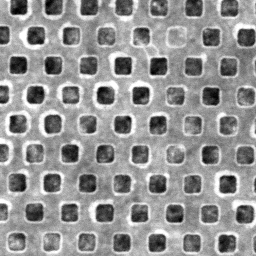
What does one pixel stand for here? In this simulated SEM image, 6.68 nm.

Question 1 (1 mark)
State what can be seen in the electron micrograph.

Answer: a regular array of holes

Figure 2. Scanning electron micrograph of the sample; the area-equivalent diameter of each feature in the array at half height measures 0.138 um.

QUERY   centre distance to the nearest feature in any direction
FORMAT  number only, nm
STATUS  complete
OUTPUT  228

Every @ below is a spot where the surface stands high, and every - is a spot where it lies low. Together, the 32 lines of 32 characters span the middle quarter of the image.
@@@@-----@@@-----@@@@-----@@@@--
@@@@----@@@@-----@@@@-----@@@@--
@@@@----@@@@@----@@@@-----@@@@--
@@@@@@@@@@@@@@@@@@@@@@@@@@@@@@@@
@@@@@@@@@@@@@@@@@@@@@@@@@@@@@@@@
----@@@@@---@@@@@@--@@@@@@@--@@@
----@@@@-----@@@@-----@@@@----@@
----@@@@-----@@@@-----@@@@----@@
----@@@@-----@@@@-----@@@@----@@
----@@@@-----@@@@----@@@@-----@@
@@@@@@@@@--@@@@@@@@@@@@@@@@@@@@@
@@@@@@@@@@@@@@@@@@@@@@@@@@@@@@@@
@@@@@@@@@@@@@@@@@@@@@@@@@@@@@@@@
@@@@----@@@@@----@@@@-----@@@@--
@@@-----@@@@-----@@@@-----@@@@--
@@@-----@@@@-----@@@@-----@@@@--
@@@@----@@@@-----@@@@-----@@@@--
@@@@@--@@@@@@----@@@@@---@@@@@--
@@@@@@@@@@@@@@@@@@@@@@@@@@@@@@@@
@@@@@@@@@@@@@@@@@@@@@@@@@@@@@@@@
----@@@@----@@@@@----@@@@@----@@
----@@@@-----@@@@-----@@@-----@@
----@@@@-----@@@@-----@@@-----@@
----@@@@-----@@@@-----@@@-----@@
---@@@@@----@@@@@----@@@@@----@@
@@@@@@@@@@@@@@@@@@@@@@@@@@@@@@@@
@@@@@@@@@@@@@@@@@@@@@@@@@@@@@@@@
@@@@@--@@@@@@---@@@@@@@@@@@@@@@@
@@@@----@@@@-----@@@@-----@@@@--
@@@-----@@@@-----@@@@-----@@@@--
@@@-----@@@@-----@@@@-----@@@@--
@@@@----@@@@-----@@@@-----@@@@--